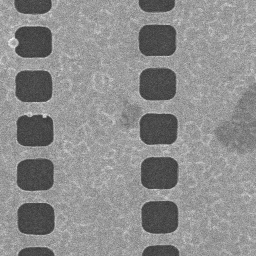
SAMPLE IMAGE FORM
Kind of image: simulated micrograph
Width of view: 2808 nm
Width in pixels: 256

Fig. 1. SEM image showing a regular array of holes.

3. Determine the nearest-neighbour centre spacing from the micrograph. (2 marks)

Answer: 44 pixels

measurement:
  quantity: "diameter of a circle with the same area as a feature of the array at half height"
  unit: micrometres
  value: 0.407